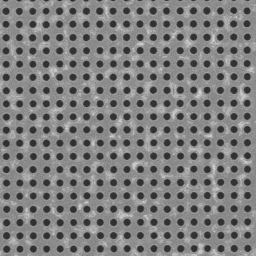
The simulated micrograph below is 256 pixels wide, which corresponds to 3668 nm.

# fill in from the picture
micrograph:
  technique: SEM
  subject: a regular array of holes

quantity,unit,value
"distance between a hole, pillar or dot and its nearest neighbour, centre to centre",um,0.186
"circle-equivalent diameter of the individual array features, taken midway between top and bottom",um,0.102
